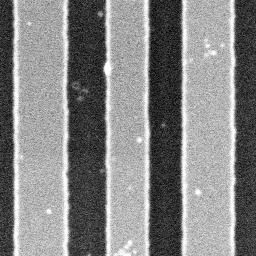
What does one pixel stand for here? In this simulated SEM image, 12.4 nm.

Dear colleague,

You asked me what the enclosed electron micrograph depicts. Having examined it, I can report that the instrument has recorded lines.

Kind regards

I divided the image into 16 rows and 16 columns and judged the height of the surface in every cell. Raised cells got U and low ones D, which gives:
DUUUDDDUUDDDUUUD
DUUUDDDUUDDDUUUD
DUUUDDDUUDDDUUUD
DUUUDDDUUDDDUUUD
DUUUDDDUUDDDUUUD
DUUUDDDUUDDDUUUD
DUUUDDDUUDDDUUUD
DUUUDDDUUDDDUUUD
DUUUDDDUUDDDUUUD
DUUUDDDUUDDDUUUD
DUUUDDDUUDDDUUUD
DUUUDDDUUDDDUUUD
DUUUDDDUUDDDUUUD
DUUUDDDUUDDDUUUD
DUUUDDDUUDDDUUUD
DUUUDDDUUDDDUUUD